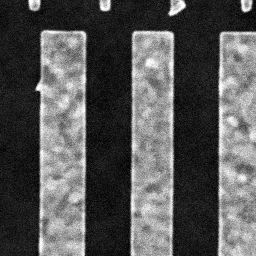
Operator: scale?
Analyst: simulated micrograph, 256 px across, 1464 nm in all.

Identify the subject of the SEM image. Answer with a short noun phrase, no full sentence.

wiring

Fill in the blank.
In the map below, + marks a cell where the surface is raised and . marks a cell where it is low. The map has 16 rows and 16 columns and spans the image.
................
................
...++...+++...++
...++...+++...++
...++...+++...++
..+++...+++...++
...++...+++...++
...++...+++...++
...++...+++...++
...++...+++...++
...++...+++...++
...++...+++...++
...++...+++...++
...++...+++...++
...++...+++...++
..+++...+++...++